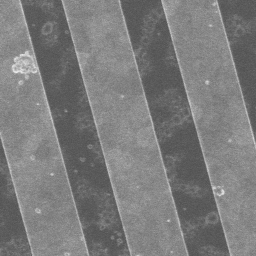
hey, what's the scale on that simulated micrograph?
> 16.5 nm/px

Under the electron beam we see one or a few lines or trenches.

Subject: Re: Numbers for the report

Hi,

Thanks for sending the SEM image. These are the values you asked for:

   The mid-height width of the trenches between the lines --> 666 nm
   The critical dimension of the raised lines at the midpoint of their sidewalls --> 0.9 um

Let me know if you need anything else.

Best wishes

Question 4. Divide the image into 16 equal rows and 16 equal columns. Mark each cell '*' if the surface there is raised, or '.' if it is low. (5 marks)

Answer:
*...****..****..
**..****...***..
**...***...***..
**...***...***..
**...****..****.
***..****...***.
***...***...***.
***...***...****
****..****..****
****..****...***
.***...***...***
.***...****..***
.****..****..***
.****...***..***
..***...***...**
..***...****..**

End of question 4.